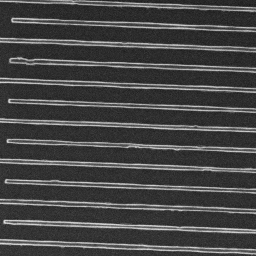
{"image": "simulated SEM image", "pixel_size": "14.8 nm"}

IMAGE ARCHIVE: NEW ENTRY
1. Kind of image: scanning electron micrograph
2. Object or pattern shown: parallel lines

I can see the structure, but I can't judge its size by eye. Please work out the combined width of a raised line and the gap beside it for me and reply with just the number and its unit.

0.299 um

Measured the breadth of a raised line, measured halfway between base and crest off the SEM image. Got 50 nm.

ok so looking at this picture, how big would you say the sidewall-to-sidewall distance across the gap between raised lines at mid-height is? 16.9 pixels